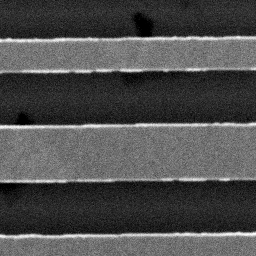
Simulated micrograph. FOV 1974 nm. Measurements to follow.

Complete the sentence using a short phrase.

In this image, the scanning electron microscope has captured lines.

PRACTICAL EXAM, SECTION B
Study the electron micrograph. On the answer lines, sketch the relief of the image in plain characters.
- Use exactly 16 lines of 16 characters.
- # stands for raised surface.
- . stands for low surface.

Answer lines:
................
................
#..#############
################
................
................
................
................
################
################
################
................
................
................
................
################